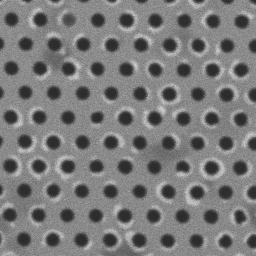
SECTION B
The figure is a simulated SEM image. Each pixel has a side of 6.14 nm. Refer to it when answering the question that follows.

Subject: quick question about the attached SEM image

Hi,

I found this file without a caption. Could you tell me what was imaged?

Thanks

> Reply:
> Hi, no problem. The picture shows a regular array of holes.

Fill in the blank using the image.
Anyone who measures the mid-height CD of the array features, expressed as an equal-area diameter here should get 85.1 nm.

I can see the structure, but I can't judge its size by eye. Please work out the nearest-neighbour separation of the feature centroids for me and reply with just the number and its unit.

0.172 micrometres